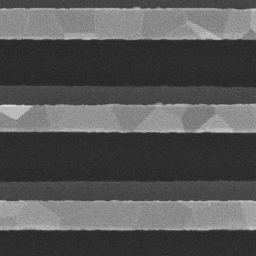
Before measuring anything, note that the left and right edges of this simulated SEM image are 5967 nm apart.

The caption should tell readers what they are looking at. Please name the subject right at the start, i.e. lines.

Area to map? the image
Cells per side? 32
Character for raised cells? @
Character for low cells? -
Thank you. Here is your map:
@@@@@@@@@@@@@@@@@@@@@@@@@@@@@@@@
@@@@@@@@@@@@@@@@@@@@@@@@@@@@@@@@
@@@@@@@@@@@@@@@@@@@@@@@@@@@@@@@@
@@@@@@@@@@@@@@@@@@@@@@@@@@@@@@@@
@@@@@@@@@@@@@@@@@@@@@@@@@@@@@@@@
--------------------------------
--------------------------------
--------------------------------
--------------------------------
--------------------------------
--------------------------------
@@@@@@@@@@@@@@@@@@@@@@@@@@@@@@@@
@@@@@@@@@@@@@@@@@@@@@@@@@@@@@@@@
@@@@@@@@@@@@@@@@@@@@@@@@@@@@@@@@
@@@@@@@@@@@@@@@@@@@@@@@@@@@@@@@@
@@@@@@@@@@@@@@@@@@@@@@@@@@@@@@@@
--@-@-----@@@@@@@@@@@@@@@@@@@@@@
--------------------------------
--------------------------------
--------------------------------
--------------------------------
--------------------------------
--------------------------------
@@@@@@@@@@@@@@@@@@@@@@@@@@@@@@@@
@@@@@@@@@@@@@@@@@@@@@@@@@@@@@@@@
@@@@@@@@@@@@@@@@@@@@@@@@@@@@@@@@
@@@@@@@@@@@@@@@@@@@@@@@@@@@@@@@@
@@@@@@@@@@@@@@@@@@@@@@@@@@@@@@@@
@@@@@@@@@@@@@@@@@@@@@@@@@@@@@@@@
--------------------------------
--------------------------------
--------------------------------